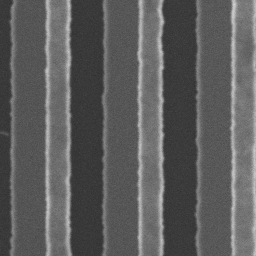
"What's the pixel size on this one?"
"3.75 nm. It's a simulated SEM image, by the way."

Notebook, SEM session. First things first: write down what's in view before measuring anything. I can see lines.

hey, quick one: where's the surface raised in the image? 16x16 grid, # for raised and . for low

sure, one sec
.###..####..####
.###...###..####
.###...###..####
.###...###..####
.###...###..####
.###...###..####
.###..####..####
.###...###..####
.###..####..####
.###..####..####
.###..####..####
.###..####..####
.###..####..####
.###..####..####
.###..####..####
.###..####..####